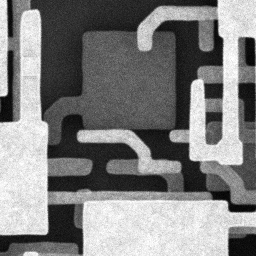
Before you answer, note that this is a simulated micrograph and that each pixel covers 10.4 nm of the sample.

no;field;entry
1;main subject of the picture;wiring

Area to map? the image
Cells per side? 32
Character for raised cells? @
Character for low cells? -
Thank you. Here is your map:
@--------------------------@@@@@
@--@@--------------@@@@@@@@@@@@@
@--@@-------------@@@@@@@--@@@@@
@--@@------------@@@-------@@@@@
@-@@@------------@@---------@@@@
@@@@@------------@@---------@@--
@-@@@-----------------------@@--
@--@@-----------------------@@--
@--@@-----------------------@@@@
@--@@-----------------------@@@@
@--@@-------------------@---@@--
@--@@-------------------@@--@@--
---@@-------------------@@@@@@--
---@@-------------------@@@@@@--
---@@-------------------@@--@@--
@@@@@@------------------@@--@@--
@@@@@@----@@@@@@@----@@@@@--@@@@
@@@@@@----@@@@@@@@---@@@@@@-@@@@
@@@@@@----------@@@-----@@@@@@--
@@@@@@-----------@@-----@@@@@@--
@@@@@@-----------@@@@@---@@@@@--
@@@@@@------------@@@@---@@@@---
@@@@@@----------------------@@--
@@@@@@-----------------------@@-
@@@@@@@@@@@@@@@@@@@@@@@@@@---@@@
@@@@@@----@@@@@@@@@@@@@@@@@@----
@@@@@@----@@@@@@@@@@@@@@@@@@@---
@@@@@@----@@@@@@@@@@@@@@@@@@@@@@
@@@@@@----@@@@@@@@@@@@@@@@@@@@@@
----------@@@@@@@@@@@@@@@@@@@---
-----------@@@@@@@@@@@@@@@@@----
----------@@@@@@@@@@@@@@@@@@----